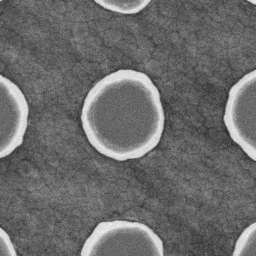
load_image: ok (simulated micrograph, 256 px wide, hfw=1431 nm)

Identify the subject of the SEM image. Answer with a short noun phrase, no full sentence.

raised bodies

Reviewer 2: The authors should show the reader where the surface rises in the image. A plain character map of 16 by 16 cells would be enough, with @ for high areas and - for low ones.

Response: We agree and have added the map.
-------@@-------
----------------
----------------
----------------
----------------
@-----@@@@-----@
@----@@@@@----@@
@@---@@@@@----@@
@-----@@@@-----@
-------@@-------
----------------
----------------
----------------
----------------
------@@@------@
@----@@@@@-----@